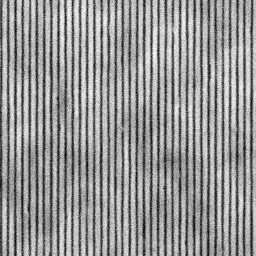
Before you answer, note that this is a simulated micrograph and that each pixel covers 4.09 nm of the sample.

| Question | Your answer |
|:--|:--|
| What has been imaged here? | parallel lines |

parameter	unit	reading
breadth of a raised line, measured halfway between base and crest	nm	20.4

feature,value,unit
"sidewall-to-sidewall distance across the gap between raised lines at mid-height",0.0102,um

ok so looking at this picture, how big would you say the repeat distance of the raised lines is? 29.2 nm